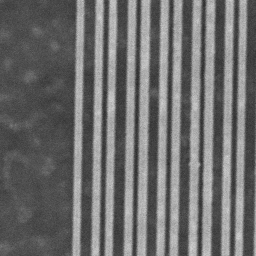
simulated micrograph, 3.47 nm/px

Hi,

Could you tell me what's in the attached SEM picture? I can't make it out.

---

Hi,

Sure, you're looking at parallel lines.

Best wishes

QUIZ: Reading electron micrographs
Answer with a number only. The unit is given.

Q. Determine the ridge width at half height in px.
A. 6.86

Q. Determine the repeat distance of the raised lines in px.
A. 16.3